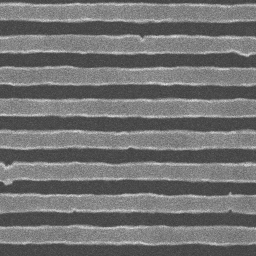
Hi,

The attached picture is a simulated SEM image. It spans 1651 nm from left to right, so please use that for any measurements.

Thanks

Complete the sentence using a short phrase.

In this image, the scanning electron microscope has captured parallel lines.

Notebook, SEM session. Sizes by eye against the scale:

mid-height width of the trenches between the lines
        87.1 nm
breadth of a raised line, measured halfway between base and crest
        116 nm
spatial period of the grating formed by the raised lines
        205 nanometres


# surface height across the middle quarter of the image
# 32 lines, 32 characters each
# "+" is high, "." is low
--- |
++..............................
++++++++++++++++++++++++++++++++
++++++++++++++++++++++++++++++++
++++++++++++++++++++++++++++++++
++++++++++++++++++++++++++++++++
................................
................................
................................
................................
++++++++++++++++++++++++++++++++
++++++++++++++++++++++++++++++++
++++++++++++++++++++++++++++++++
++++++++++++++++++++++++++++++++
................................
................................
................................
................................
++++++++++++++++++++++++++++++++
++++++++++++++++++++++++++++++++
++++++++++++++++++++++++++++++++
++++++++++++++++++++++++++++++++
................................
................................
................................
................................
++++++++++++++++++++++++++++++++
++++++++++++++++++++++++++++++++
++++++++++++++++++++++++++++++++
++++++++++++++++++++++++++++++++
................................
................................
................................